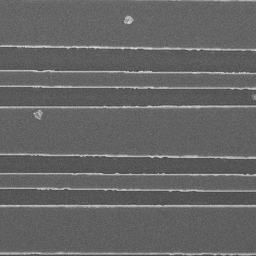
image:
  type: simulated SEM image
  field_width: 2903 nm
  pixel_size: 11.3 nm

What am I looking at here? lines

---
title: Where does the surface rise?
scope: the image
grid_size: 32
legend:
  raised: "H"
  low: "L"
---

HHHHHHHHHHHHHHHHHHHHHHHHHHHHHHHH
HHHHHHHHHHHHHHHHHHHHHHHHHHHHHHHH
HHHHHHHHHHHHHHHHHHHHHHHHHHHHHHHH
HHHHHHHHHHHHHHHHHHHHHHHHHHHHHHHH
HHHHHHHHHHHHHHHHHHHHHHHHHHHHHHHH
HHHHHHHHHHHHHHHHHHHHHHHHHHHHHHHH
LLLLLLLLLLLLLLLLLLLLLLLLLLLLLLLL
LLLLLLLLLLLLLLLLLLLLLLLLLLLLLLLL
LLLLLLLLLLLLLLLLLLLLLLLLLLLLLLLL
HHHHHHHHHHHHHHHHHHHHHHHHHHHHHHHH
HHHHHHHHHHHHHHHHHHHHHHHHHHHHHHHH
LLLLLLLLLLLLLLLLLLLLLLLLLLLLLLLL
LLLLLLLLLLLLLLLLLLLLLLLLLLLLLLLL
HHHHHHHHHHHHHHHHHHHHHHHHHHHHHHHH
HHHHHHHHHHHHHHHHHHHHHHHHHHHHHHHH
HHHHHHHHHHHHHHHHHHHHHHHHHHHHHHHH
HHHHHHHHHHHHHHHHHHHHHHHHHHHHHHHH
HHHHHHHHHHHHHHHHHHHHHHHHHHHHHHHH
HHHHHHHHHHHHHHHHHHHHHHHHHHHHHHHH
LLLLLLLLLLHHLHHHHHHHHHHHHHHHHHHH
LLLLLLLLLLLLLLLLLLLLLLLLLLLLLLLL
LLLLLLLLLLLLLLLLLLLLLLLLLLLLLLLL
HHHHHHHHHHHHHHHHHHHHHHHHHHHHHHHH
HHHHHHHHHHHHHHHHHHHHHHHHHHHHHHHH
LLLLLLLLLLLLLLLLLLLLLLLLLLLLLLLL
LLLLLLLLLLLLLLLLLLLLLLLLLLLLLLLL
HHHHHHHHHHHHHHHHHHHHHHHHHHHHHHHH
HHHHHHHHHHHHHHHHHHHHHHHHHHHHHHHH
HHHHHHHHHHHHHHHHHHHHHHHHHHHHHHHH
HHHHHHHHHHHHHHHHHHHHHHHHHHHHHHHH
HHHHHHHHHHHHHHHHHHHHHHHHHHHHHHHH
HHHHHHHHHHHHHHHHHHHHHHHHHHHHHHHH